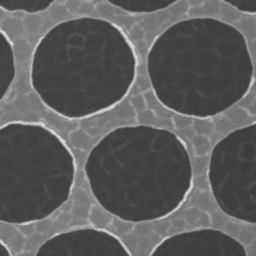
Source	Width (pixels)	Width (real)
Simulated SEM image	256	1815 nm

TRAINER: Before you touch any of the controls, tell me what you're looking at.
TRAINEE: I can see holes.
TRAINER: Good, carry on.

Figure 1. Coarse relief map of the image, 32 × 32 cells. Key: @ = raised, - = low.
------@@@@@@@@-------@@@@@@@@---
@@@--@@@@@@@@@@@---@@@@@@@@@@@@-
@@@@@@@@@----@@@-@@@@@@----@@@@@
@@@@@@@--------@@@@@@--------@@@
@@@@@@---------@@@@@----------@@
-@@@@-----------@@@------------@
--@@-------------@@------------@
--@@-------------@-------------@
--@@-------------@--------------
--@@-------------@@------------@
-@@@------------@@@------------@
-@@@@-----------@@@------------@
@@@@@----------@@@@@----------@@
@@@@@@-------@@@@@@@@--------@@@
@@@@@-@@---@@@@@@@@@@@@@--@@@@@@
@@@@@@@@@@@@@@@@@@@@@@@@@@@@@@@@
------@@@@@@@@-------@@@@@@@@---
-------@@@@@@---------@@@@@@----
--------@@@@-----------@@@@-----
---------@@-------------@@------
---------@@-------------@@------
---------@@-------------@@------
---------@@-------------@@------
---------@@-------------@@------
---------@@@-----------@@@@-----
--------@@@@----------@@@@@-----
-------@@@@@@@-------@@@@@@@----
-----@@@@@@@@@@----@@@@@@@@@@@--
@@@@@@@@@@@@@@@@@@@@@@@@@@@@@@@@
@@@@@@@-------@@@@@@@@-------@@@
@@@@@----------@@@@@----------@@
-@@@@-----------@@@------------@